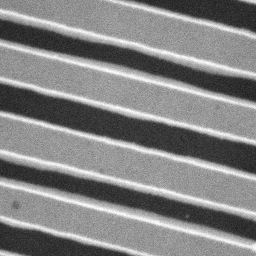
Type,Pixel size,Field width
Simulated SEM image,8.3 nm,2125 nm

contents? lines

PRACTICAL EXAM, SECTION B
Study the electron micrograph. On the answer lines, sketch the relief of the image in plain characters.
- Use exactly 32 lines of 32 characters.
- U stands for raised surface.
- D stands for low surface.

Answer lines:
UUUUUUUUUUUUUUUUDDDDDDDDDDDDDDDD
UUUUUUUUUUUUUUUUUUUUDDDDDDDDDDDD
DDDDUUUUUUUUUUUUUUUUUUUUDDDDDDDD
DDDDDDDDUUUUUUUUUUUUUUUUUUUUDDDD
DDDDDDDDDDDUUUUUUUUUUUUUUUUUUUUU
DDDDDDDDDDDDDDDDUUUUUUUUUUUUUUUU
UUUUUDDDDDDDDDDDDDDUUUUUUUUUUUUU
UUUUUUUUUDDDDDDDDDDDDDDUUUUUUUUU
UUUUUUUUUUUUUDDDDDDDDDDDDDDUUUUU
UUUUUUUUUUUUUUUUUDDDDDDDDDDDDDDD
DDUUUUUUUUUUUUUUUUUUUDDDDDDDDDDD
DDDDDDUUUUUUUUUUUUUUUUUUUDDDDDDD
DDDDDDDDDDUUUUUUUUUUUUUUUUUUUDDD
DDDDDDDDDDDDDDUUUUUUUUUUUUUUUUUU
UUDDDDDDDDDDDDDDDDUUUUUUUUUUUUUU
UUUUUUDDDDDDDDDDDDDDDDUUUUUUUUUU
UUUUUUUUUDDDDDDDDDDDDDDDDDUUUUUU
UUUUUUUUUUUUUDDDDDDDDDDDDDDDDDUU
UUUUUUUUUUUUUUUUUDDDDDDDDDDDDDDD
DDUUUUUUUUUUUUUUUUUUUDDDDDDDDDDD
DDDDDUUUUUUUUUUUUUUUUUUUUDDDDDDD
DDDDDDDDDDUUUUUUUUUUUUUUUUUUUDDD
DDDDDDDDDDDDDDUUUUUUUUUUUUUUUUUU
UUUDDDDDDDDDDDDDDDUUUUUUUUUUUUUU
UUUUUUUDDDDDDDDDDDDDDDUUUUUUUUUU
UUUUUUUUUUUDDDDDDDDDDDDDDDUUUUUU
UUUUUUUUUUUUUUUDDDDDDDDDDDDDDDUU
DUUUUUUUUUUUUUUUUUUDDDDDDDDDDDDD
DDDDDUUUUUUUUUUUUUUUUUUDDDDDDDDD
DDDDDDDDDUUUUUUUUUUUUUUUUUUDDDDD
DDDDDDDDDDDDDUUUUUUUUUUUUUUUUUUD
DDDDDDDDDDDDDDDDUUUUUUUUUUUUUUUU